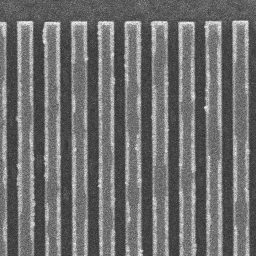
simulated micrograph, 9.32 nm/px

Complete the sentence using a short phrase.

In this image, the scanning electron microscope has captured parallel lines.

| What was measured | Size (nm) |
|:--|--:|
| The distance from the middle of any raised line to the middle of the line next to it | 251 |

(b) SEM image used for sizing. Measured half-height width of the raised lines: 141 nm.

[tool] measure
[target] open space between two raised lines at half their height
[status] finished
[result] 114 nanometres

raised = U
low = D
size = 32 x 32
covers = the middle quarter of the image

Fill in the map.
DDUUUDDDDUUUDDDUUUUDDDUUUUDDDUUU
DDUUUDDDDUUUDDDUUUUDDDUUUUDDDUUU
DDUUUDDDDUUUDDDUUUUDDDUUUUDDDUUU
DDUUUDDDDUUUUDDUUUUDDDUUUUDDDUUU
DDUUUDDDDUUUUDDUUUUDDDUUUUDDDUUU
DDUUUDDDDUUUDDDDUUUDDDUUUUDDDUUU
DDUUUDDDDUUUDDDDUUUDDDUUUUDDDUUU
DDUUUDDDDUUUDDDDUUUDDDUUUUDDDUUU
DDUUUDDDDUUUDDDDUUUDDDUUUUDDDUUU
DDUUUDDDDUUUDDDUUUUDDDUUUUDDDUUU
DDUUUDDDDUUUDDDUUUUDDDUUUUDDDUUU
DDUUUDDDDUUUDDDUUUUDDDUUUUDDDUUU
DDUUUDDDDUUUDDDDUUUDDDUUUUDDDUUU
DDUUUDDDDUUUDDDDUUUDDDUUUUDDDUUU
DDUUUDDDDUUUDDDDUUUDDDUUUUDDDUUU
DDUUUDDDDUUUDDDDUUUDDDUUUUDDDUUU
DDUUUDDDDUUUDDDDUUUDDDUUUUDDDUUU
DDUUUDDDDUUUDDDUUUUDDDUUUUDDDUUU
DDUUUUDDDUUUDDDDUUUDDDUUUUDDDUUU
DDUUUUDDDUUUDDDDUUUDDDUUUUDDDUUU
DDUUUUDDDUUUDDDDUUUDDDUUUUDDDUUU
DDUUUUDDDUUUDDDDUUUDDDUUUUDDDUUU
DDUUUUDDDUUUDDDDUUUDDDUUUUDDDUUU
DDUUUUDDDUUUDDDDUUUDDDUUUUDDDUUU
DDUUUUDDDUUUDDDUUUUDDDUUUUDDDUUU
DDUUUUDDDUUUDDDUUUUDDDUUUUDDDUUU
DDUUUUDDDUUUDDDDUUUDDDUUUUDDDUUU
DDUUUUDDDUUUDDDDUUUDDDUUUUDDDUUU
DDUUUUDDDUUUDDDDUUUDDDUUUUDDDUUU
DDUUUUDDDUUUDDDUUUUDDDUUUUDDDUUU
DDUUUUDDDUUUDDDDUUUDDDUUUUDDDUUU
DDUUUUDDDUUUDDDDUUUDDDUUUUDDDUUU